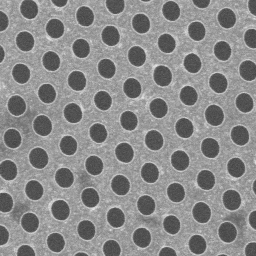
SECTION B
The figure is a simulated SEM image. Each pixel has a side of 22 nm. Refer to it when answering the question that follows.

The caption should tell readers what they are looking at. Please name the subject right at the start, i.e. a regular array of holes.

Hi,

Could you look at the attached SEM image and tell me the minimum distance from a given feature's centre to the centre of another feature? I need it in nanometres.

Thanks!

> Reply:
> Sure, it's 711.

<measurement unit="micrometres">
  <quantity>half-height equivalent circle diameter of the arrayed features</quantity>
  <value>0.427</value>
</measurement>